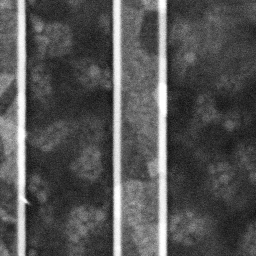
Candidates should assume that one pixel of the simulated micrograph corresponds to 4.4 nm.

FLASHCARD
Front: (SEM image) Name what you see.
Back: one or a few lines or trenches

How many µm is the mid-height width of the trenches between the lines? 0.418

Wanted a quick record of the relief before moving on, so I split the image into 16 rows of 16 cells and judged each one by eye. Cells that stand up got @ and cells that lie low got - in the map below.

@------@@@------
@------@@@------
@------@@@------
@------@@@------
@------@@@------
@------@@@------
@------@@@------
@------@@@------
@------@@@------
@------@@@------
@------@@@------
@------@@@------
@------@@@------
@------@@@------
@------@@@------
@------@@@------